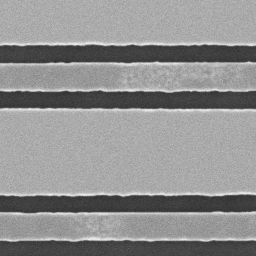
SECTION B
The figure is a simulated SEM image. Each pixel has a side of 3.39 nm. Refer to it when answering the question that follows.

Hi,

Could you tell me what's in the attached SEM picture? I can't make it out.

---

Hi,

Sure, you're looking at lines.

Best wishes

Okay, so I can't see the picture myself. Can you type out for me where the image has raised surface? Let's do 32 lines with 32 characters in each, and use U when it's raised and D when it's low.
UUUUUUUUUUUUUUUUUUUUUUUUUUUUUUUU
UUUUUUUUUUUUUUUUUUUUUUUUUUUUUUUU
UUUUUUUUUUUUUUUUUUUUUUUUUUUUUUUU
UUUUUUUUUUUUUUUUUUUUUUUUUUUUUUUU
UUUUUUUUUUUUUUUUUUUUUUUUUUUUUUUU
UUUUUUUUUUUDUUUUUUUUUUUUUUUUUUUU
DDDDDDDDDDDDDDDDDDDDDDDDDDDDDDDD
DDDDDDDDDDDDDDDDDDDDDDDDDDDDDDDD
UUUUUUUUUUUUUUUUUUUUUUUUUUUUUUUU
UUUUUUUUUUUUUUUUUUUUUUUUUUUUUUUU
UUUUUUUUUUUUUUUUUUUUUUUUUUUUUUUU
DDDDDDDDDDDDDDDDDDDDDDDDDDDDDDDD
DDDDDDDDDDDDDDDDDDDDDDDDDDDDDDDD
DDDDDDDDDDDDDDDDDDDDDDDDDDDDDDDD
UUUUUUUUUUUUUUUUUUUUUUUUUUUUUUUU
UUUUUUUUUUUUUUUUUUUUUUUUUUUUUUUU
UUUUUUUUUUUUUUUUUUUUUUUUUUUUUUUU
UUUUUUUUUUUUUUUUUUUUUUUUUUUUUUUU
UUUUUUUUUUUUUUUUUUUUUUUUUUUUUUUU
UUUUUUUUUUUUUUUUUUUUUUUUUUUUUUUU
UUUUUUUUUUUUUUUUUUUUUUUUUUUUUUUU
UUUUUUUUUUUUUUUUUUUUUUUUUUUUUUUU
UUUUUUUUUUUUUUUUUUUUUUUUUUUUUUUU
UUUUUUUUUUUUUUUUUUUUUUUUUUUUUUUU
DDUDDDDDDDDDDDDUDDDDDDDDDDDDDDDD
DDDDDDDDDDDDDDDDDDDDDDDDDDDDDDDD
DDDDDDDDDDDDDDDDDDDDDDDDDDDDDDDD
UUUUUUUUUUUUUUUUUUUUUUUUUUUUUUUU
UUUUUUUUUUUUUUUUUUUUUUUUUUUUUUUU
UUUUUUUUUUUUUUUUUUUUUUUUUUUUUUUU
DDDDDDDDDDDDDDDDDDDDDDDDDDDDDDDD
DDDDDDDDDDDDDDDDDDDDDDDDDDDDDDDD